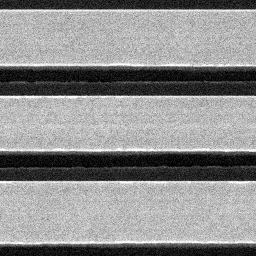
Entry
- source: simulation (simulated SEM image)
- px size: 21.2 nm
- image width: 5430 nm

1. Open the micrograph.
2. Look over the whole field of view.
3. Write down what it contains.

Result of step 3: lines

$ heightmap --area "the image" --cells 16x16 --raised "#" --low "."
................
################
################
################
................
................
################
################
################
................
................
################
################
################
################
................